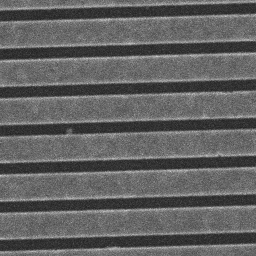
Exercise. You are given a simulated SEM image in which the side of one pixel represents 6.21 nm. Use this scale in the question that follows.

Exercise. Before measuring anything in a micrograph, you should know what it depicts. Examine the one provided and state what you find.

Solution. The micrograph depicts parallel lines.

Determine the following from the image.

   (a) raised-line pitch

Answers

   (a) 238 nanometers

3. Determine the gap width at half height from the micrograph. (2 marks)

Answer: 78.4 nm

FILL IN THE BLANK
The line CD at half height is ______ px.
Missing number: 25.2